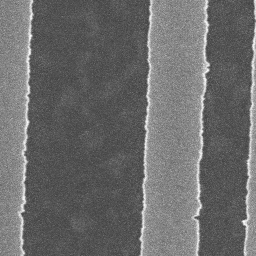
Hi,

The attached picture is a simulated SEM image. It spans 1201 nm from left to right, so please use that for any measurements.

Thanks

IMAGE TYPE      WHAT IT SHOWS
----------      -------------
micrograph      one or a few lines or trenches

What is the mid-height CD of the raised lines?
268 nm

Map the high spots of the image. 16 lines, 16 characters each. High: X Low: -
XX-------XXXX---
XX-------XXXX---
XX-------XXXX---
XX-------XXXX---
XX-------XXXX---
XX-------XXXX---
XX-------XXXX---
XX-------XXXX---
XX-------XXXX---
XX-------XXXX---
XX-------XXX---X
XX-------XXX---X
XX-------XXXX--X
X--------XXX---X
X--------XXX---X
X--------XXX---X